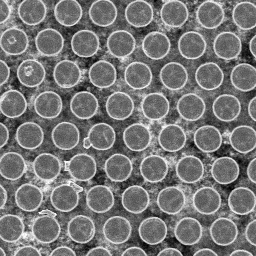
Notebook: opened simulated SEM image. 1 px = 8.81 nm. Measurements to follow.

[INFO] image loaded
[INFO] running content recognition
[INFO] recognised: a regular array of raised bodies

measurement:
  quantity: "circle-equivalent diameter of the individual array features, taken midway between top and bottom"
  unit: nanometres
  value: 230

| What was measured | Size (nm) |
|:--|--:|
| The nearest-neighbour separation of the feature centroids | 311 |